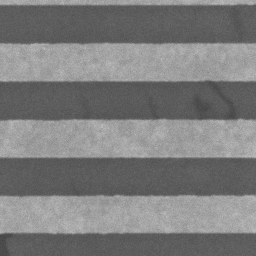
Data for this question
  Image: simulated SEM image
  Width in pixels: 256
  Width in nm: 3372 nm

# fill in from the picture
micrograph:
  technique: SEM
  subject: lines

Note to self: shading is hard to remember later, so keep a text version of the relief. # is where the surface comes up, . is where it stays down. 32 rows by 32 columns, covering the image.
################################
................................
................................
................................
................................
.............#..................
################################
################################
################################
################################
................................
................................
................................
................................
................................
################################
################################
################################
################################
################################
................................
................................
................................
................................
......#.....#.##..#...###.######
################################
################################
################################
################################
................................
................................
................................